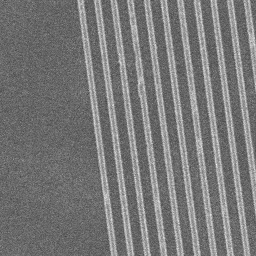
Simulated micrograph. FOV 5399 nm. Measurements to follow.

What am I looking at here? parallel lines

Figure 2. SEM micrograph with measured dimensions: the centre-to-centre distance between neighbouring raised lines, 348 nm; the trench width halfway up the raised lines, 267 nm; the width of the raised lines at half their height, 94.1 nanometers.